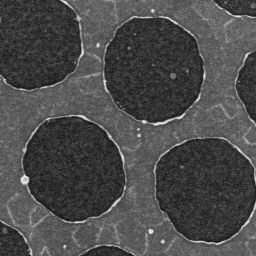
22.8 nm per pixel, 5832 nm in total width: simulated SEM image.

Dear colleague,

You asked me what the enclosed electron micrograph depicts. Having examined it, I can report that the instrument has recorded holes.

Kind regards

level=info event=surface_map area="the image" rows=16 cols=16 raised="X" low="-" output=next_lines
----XXXXXXXXXX--
-----XXX---XXXXX
-----XX-----XXXX
-----XX------XXX
----XXX------XX-
X-XXXXX------XX-
XXXXXXX-----XXX-
XXX---XXX--XXXXX
XX-----XXXXXXXXX
XX-----XXX-----X
X-------XX------
XX------XX------
XX-----XXX------
XXXX--XXXX------
-XXXXXXXXXX----X
--XXXX-XXXXXXXXX